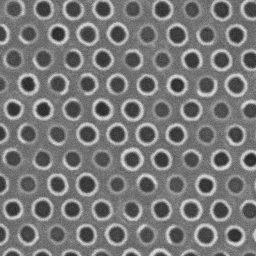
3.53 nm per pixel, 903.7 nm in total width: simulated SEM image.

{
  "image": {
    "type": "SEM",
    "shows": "a regular array of holes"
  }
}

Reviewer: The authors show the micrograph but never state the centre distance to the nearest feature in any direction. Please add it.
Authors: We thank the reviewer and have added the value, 102 nm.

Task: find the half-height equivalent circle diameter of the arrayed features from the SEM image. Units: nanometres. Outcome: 55.6